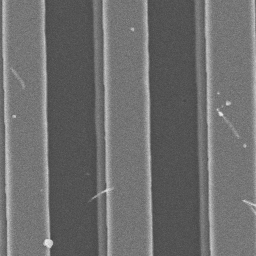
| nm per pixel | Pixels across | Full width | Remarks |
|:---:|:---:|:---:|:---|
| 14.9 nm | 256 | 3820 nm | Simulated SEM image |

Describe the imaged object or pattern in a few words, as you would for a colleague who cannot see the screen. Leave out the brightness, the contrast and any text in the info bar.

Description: lines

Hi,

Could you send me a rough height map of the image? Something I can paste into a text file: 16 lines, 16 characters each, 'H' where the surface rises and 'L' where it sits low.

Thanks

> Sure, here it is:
HHHLLLHHHLLLLHHH
HHHLLLHHHLLLLHHH
HHHLLLLHHLLLLHHH
HHHLLLLHHLLLLHHH
HHHLLLLHHLLLLHHH
HHHLLLLHHLLLLHHH
HHHLLLLHHLLLLHHH
HHHLLLLHHLLLLHHH
HHHLLLLHHLLLLHHH
HHHLLLLHHLLLLHHH
HHHLLLLHHLLLLHHH
HHHLLLLHHLLLLHHH
HHHLLLLHHLLLLHHH
HHHLLLLHHLLLLHHH
HHHLLLLHHLLLLHHH
HHHLLLLHHLLLLHHH